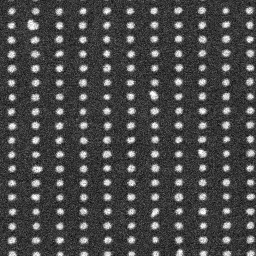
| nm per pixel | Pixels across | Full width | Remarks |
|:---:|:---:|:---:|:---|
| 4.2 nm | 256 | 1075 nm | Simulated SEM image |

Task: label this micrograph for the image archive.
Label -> a regular array of raised bodies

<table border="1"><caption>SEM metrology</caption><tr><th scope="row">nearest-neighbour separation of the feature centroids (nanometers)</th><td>59.5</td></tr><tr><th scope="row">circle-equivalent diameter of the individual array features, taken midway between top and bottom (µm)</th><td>0.0284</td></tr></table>